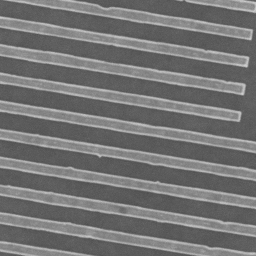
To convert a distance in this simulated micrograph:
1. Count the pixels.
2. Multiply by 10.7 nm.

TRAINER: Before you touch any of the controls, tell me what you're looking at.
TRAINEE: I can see parallel lines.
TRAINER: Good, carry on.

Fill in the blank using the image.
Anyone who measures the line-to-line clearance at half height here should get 201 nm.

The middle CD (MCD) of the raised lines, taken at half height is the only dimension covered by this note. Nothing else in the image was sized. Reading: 9 pixels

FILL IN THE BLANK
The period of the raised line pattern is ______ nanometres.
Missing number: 297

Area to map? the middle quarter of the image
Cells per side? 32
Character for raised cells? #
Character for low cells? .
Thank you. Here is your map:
.###############................
........##############..........
..............##############....
....................############
..........................######
##..............................
##########......................
..##############................
.......###############..........
..............##############....
....................############
..........................######
###.............................
##########......................
..##############................
.......#############............
.............###############....
...................#############
..........................######
###.............................
#########.......................
..#############.................
........##############..........
...............#############....
.....................###########
...........................#####
###.............................
#########.......................
..#############.................
........#############...........
..............##############....
.....................###########